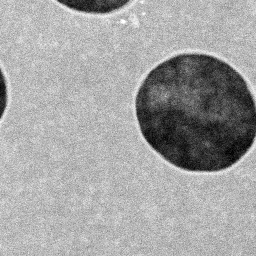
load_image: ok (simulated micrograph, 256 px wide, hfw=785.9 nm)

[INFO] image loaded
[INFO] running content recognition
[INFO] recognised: holes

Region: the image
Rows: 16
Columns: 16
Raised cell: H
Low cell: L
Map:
HHHHLLLLHHHHHHHH
HHHHHHHHHHHHHHHH
HHHHHHHHHHHHHHHH
HHHHHHHHHHHLLHHH
HHHHHHHHHLLLLLLH
HHHHHHHHHLLLLLLL
HHHHHHHHLLLLLLLL
HHHHHHHHHLLLLLLL
HHHHHHHHHLLLLLLL
HHHHHHHHHHLLLLLH
HHHHHHHHHHHLLLHH
HHHHHHHHHHHHHHHH
HHHHHHHHHHHHHHHH
HHHHHHHHHHHHHHHH
HHHHHHHHHHHHHHHH
HHHHHHHHHHHHHHHH